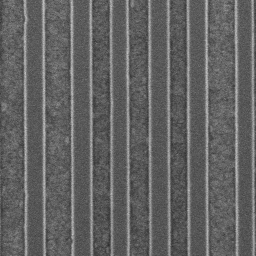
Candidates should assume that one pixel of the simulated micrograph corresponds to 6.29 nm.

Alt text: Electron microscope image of parallel lines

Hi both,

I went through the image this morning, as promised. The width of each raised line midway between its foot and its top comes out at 127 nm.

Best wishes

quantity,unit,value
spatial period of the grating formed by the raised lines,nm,264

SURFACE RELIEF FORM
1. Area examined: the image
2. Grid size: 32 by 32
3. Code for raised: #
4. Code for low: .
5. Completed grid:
...##....##...##...##..###...###
...##....##...##...##..###...###
...###...##...##...##..###...###
...###...##...##...##..###...###
...###...##...##...##...##...###
...###...##...##...##...##...###
...##....##...##...##...##...###
...##....##...##...##...##...###
...##....##...##...##...##...###
...###...##...##...##..###...###
...###...##...##...##..###...###
...###...##...##...##..###....##
...###...##...##...##..###....##
...###...##...##...##..###....##
...###...##...##...##..###....##
...###...##...##...##..###....##
...###...##...##...##..###....##
...###...##...##...##...##....##
...###...##...##...##..###....##
...###...##...##...##..###....##
...###...##...##...##..###....##
...###...##...##...##...##....##
...##....##...##...##...##....##
...##....##...##...##...##....##
...###...##...##...##...##....##
...###...##...##...##...##....##
...##....##...##...##...##....##
...###...##...##...##...##....##
...###...##...##...##...##....##
...###...##...##...##...##....##
...###...##...##...##...##....##
...###...##...##...##...##....##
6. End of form